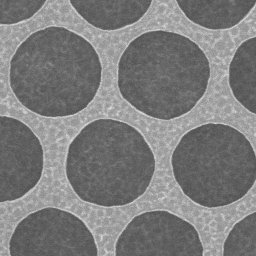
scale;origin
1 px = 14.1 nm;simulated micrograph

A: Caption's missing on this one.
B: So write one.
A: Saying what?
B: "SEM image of holes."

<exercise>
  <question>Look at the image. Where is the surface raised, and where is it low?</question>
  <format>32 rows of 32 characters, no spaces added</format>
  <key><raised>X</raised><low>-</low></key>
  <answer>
-----XXXX----------XXX----------
-----XXXXX--------XXXXX--------X
---XXXXXXXX------XXXXXXX------XX
XXXXXX--XXXX---XXXXXXXXXX----XXX
XXXX------XXXXXXX------XXXXXXXXX
XXX--------XXXXX---------XXXXX--
XX----------XXX----------XXXX---
X-----------XXX-----------XXX---
X------------XX-----------XXX---
X------------XX-----------XXX---
X------------XX-----------XXX---
XX----------XXX-----------XXX---
XX----------XXXX---------XXXXX--
XXX--------XXXXXX-------XXXXXXX-
XXXXX---XXXXXXXXXXX----XXXXXXXXX
---XXXXXXXX-----XXXXXXXXXX--XXXX
----XXXXXX-------XXXXXX-------XX
-----XXXX---------XXXXX--------X
-----XXXX----------XXX----------
-----XXX-----------XXX----------
-----XXX-----------XX-----------
-----XXX-----------XXX----------
-----XXX-----------XXX----------
----XXXXX---------XXXXX--------X
---XXXXXXX--------XXXXX--------X
XXXXXXXXXXXX----XXXXXXXXX----XXX
XXXX-----XXXXXXXXX---XXXXXXXXXXX
XXX-------XXXXXXX------XXXXXXX--
XX---------XXXXX--------XXXXX---
X-----------XXX----------XXX----
X-----------XXX----------XXX----
X-----------XX-----------XXX----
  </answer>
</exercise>